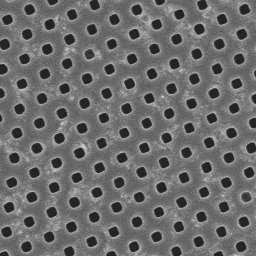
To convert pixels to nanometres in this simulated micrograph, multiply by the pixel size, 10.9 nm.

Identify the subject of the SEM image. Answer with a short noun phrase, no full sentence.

a regular array of holes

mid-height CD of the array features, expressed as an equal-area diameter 10.6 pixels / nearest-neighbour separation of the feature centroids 24.5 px